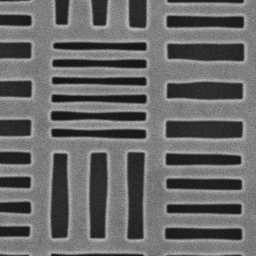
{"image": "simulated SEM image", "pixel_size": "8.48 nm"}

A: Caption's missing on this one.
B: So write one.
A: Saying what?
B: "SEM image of groups of lines, slits or small figures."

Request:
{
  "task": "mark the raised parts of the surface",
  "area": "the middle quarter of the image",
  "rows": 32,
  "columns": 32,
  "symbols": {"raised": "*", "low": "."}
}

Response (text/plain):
.....................***********
********************************
********************************
....................************
.....................***********
*******************.******......
**************************......
*******************.*****.......
.....................*****......
.....................***********
********************************
********************************
....................************
.....................***********
**************************......
*************************.......
....................*****.......
.....................****.......
*********...........******......
********************************
********************************
********************************
.******....*****....*****.......
.******....*****....*****.......
.******....*****....*****.......
.*****.....*****....*******...**
.*****.....*****....************
.*****.....*****....************
.*****.....*****....******.....*
.*****.....*****....*****.......
.*****.....*****....*****.......
.*****.....*****....************